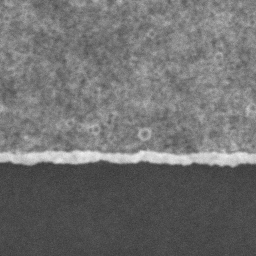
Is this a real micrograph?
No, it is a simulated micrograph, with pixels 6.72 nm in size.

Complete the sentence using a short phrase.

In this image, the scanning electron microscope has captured one or a few lines or trenches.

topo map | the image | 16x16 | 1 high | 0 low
1111111111111111
1111111111111111
1111111111111111
1111111111111111
1111111111111111
1111111111111111
1111111111111111
1111111111111111
1111111111111111
1111111111111111
0000000000000000
0000000000000000
0000000000000000
0000000000000000
0000000000000000
0000000000000000